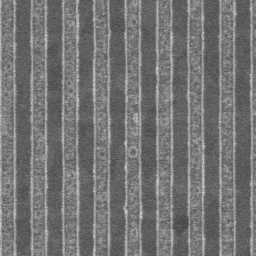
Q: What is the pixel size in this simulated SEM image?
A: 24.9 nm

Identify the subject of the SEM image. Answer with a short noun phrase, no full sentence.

parallel lines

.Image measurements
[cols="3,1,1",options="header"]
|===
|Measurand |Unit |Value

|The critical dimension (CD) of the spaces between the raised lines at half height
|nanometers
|343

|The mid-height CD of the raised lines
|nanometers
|427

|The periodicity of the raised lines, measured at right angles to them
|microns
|0.783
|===